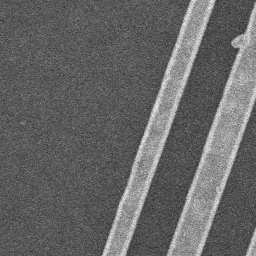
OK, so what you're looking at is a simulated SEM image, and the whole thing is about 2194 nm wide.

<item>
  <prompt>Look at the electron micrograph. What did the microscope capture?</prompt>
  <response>one or a few lines or trenches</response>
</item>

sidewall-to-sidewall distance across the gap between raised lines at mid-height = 374 nm